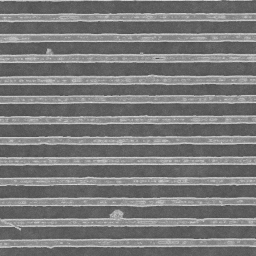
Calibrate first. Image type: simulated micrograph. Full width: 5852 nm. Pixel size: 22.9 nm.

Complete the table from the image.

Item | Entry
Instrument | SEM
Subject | parallel lines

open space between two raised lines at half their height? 0.329 micrometres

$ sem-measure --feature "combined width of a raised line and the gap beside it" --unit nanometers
469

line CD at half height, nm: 154